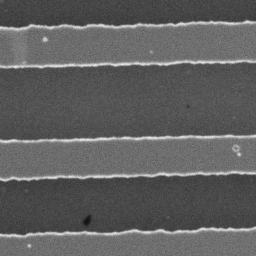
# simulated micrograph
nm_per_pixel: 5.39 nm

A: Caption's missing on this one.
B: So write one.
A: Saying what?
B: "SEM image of lines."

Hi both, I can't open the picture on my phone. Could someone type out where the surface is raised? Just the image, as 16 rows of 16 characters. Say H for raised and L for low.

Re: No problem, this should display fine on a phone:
LLLLLLLLLLLLLLLL
LLLLLLLLLLHHHHHH
HHHHHHHHHHHHHHHH
HHHHHHHHHHHHHHHH
LLLLLLLLLLLLLLLL
LLLLLLLLLLLLLLLL
LLLLLLLLLLLLLLLL
LLLLLLLLLLLLLLLL
LLLLLLLLLLLLLLHH
HHHHHHHHHHHHHHHH
HHHHHHHHHHHHHHHH
LLLLLLLLLLLLLLLL
LLLLLLLLLLLLLLLL
LLLLLLLLLLLLLLLL
LLLLLHLHHHHHHHHH
HHHHHHHHHHHHHHHH